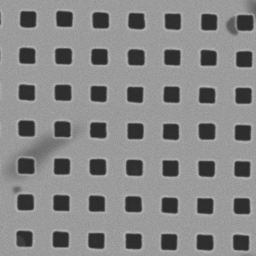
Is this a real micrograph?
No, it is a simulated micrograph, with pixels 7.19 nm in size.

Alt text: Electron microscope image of a regular array of holes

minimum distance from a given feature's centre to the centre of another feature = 0.257 micrometres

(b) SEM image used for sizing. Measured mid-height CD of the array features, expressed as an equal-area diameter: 0.13 micrometres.